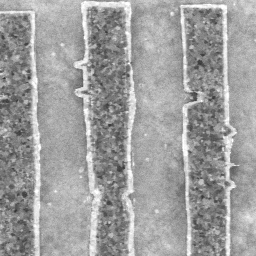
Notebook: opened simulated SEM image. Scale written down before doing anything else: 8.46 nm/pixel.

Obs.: one or a few lines or trenches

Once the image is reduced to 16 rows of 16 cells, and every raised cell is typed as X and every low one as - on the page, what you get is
-----XXX----XX--
XX---XXX---XXX--
XX---XXX----XX--
XX---XXX----XX--
XX---XXX----XX--
XX---XXX----XX--
XX---XXX----XX--
XX---XXX----XX--
XX----XX----XX--
XX----XX----XX--
XX----XX----XX--
XX----XX----XX--
XX----XX----XX--
XX----XX----XX--
XX----XX----XX--
XX----XX----XX--